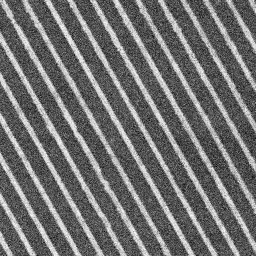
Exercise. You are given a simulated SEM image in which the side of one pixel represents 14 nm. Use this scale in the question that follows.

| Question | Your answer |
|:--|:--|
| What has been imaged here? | parallel lines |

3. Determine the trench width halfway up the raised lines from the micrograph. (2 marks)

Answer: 224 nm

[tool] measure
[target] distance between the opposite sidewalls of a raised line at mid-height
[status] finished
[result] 51.7 nm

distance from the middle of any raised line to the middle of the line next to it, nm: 276